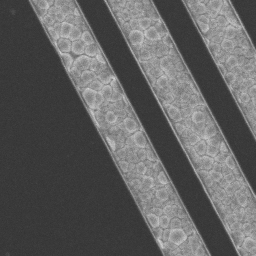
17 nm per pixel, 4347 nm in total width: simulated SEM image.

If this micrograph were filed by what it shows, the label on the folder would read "one or a few lines or trenches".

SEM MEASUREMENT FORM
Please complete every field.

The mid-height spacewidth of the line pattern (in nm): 678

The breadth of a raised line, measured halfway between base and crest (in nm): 468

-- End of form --